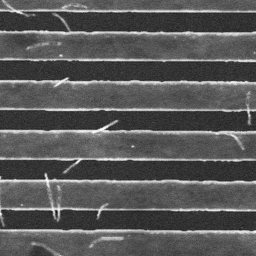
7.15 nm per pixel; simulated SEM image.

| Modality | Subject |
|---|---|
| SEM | lines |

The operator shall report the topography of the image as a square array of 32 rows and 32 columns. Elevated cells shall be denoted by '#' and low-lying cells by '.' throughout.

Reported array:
################################
................................
................................
................................
################################
################################
################################
.........#######################
................................
................................
################################
################################
################################
################################
................................
................................
##########################.###.#
################################
################################
################################
................................
................................
#....#..........................
################################
################################
################################
................................
................................
................................
################################
################################
################################